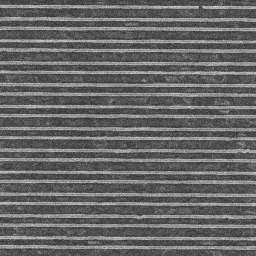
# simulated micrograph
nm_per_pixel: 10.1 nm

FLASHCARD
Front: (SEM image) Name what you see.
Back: parallel lines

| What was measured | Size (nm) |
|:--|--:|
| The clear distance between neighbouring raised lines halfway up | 73.4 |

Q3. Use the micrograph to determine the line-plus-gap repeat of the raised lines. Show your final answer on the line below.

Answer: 110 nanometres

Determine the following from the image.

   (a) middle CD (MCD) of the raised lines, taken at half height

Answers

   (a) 29.1 nm